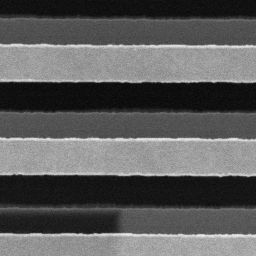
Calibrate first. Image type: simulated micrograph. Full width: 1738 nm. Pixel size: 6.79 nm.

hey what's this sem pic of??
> lines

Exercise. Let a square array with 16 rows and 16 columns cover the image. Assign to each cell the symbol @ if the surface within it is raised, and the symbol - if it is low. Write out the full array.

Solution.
----------------
@@@@@@@@@@@@@@@@
@@@@@@@@@@@@@@@@
@@@@@@@@@@@@@@@@
@@@@@@@@@@@@@@@@
----------------
----------------
@@@@@@@@@@@@@@@@
@@@@@@@@@@@@@@@@
@@@@@@@@@@@@@@@@
@@@@@@@@@@@@@@@@
----------------
----------------
@@@@@@@@@@@@@@@@
@@@@@@@@@@@@@@@@
@@@@@@@@@@@@@@@@